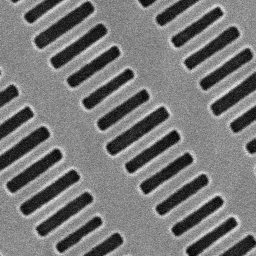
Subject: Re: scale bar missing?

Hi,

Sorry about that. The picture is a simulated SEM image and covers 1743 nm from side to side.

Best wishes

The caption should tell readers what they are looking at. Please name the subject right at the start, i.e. a regular array of holes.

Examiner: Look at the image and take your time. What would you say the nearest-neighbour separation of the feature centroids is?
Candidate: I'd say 174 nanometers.